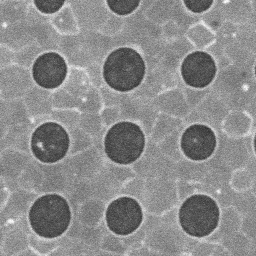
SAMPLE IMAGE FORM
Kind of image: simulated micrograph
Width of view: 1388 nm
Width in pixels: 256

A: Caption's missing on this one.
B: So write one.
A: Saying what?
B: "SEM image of a regular array of holes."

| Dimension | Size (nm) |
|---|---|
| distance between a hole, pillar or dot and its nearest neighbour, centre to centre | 394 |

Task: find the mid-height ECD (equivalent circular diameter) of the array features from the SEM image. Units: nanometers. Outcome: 221